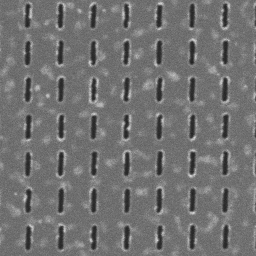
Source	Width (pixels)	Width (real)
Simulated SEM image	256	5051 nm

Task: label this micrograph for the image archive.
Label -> a regular array of holes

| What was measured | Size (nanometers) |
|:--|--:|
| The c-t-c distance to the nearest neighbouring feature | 643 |